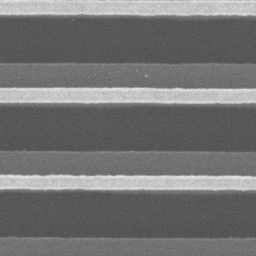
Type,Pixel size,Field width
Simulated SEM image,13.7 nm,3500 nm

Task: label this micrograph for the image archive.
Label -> lines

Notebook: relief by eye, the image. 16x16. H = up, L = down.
HHHHHHHHHHHHHHHH
LLLLLLLLLLLLLLLL
LLLLLLLLLLLLLLLL
LLLLLLLLLLLLLLLL
HHHHHHHHHHHHHHHH
HHHHHHHHHHHHHHHH
LLLLLLLLLLLLLLLL
LLLLLLLLLLLLLLLL
LLLLLLLLLLLLLLLL
HHHHHLHLHHHHLLLL
HHHHHHHHHHHHHHHH
HHHHHHHHHHHHHHHH
LLLLLLLLLLLLLLLL
LLLLLLLLLLLLLLLL
LLLLLLLLLLLLLLLL
HHHHHHHHHHHHHHHH